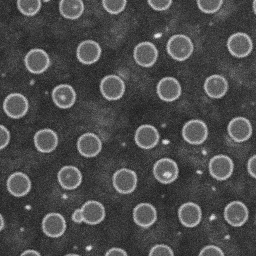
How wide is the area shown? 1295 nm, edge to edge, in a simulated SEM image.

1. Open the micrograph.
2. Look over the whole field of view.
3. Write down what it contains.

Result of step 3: a regular array of raised bodies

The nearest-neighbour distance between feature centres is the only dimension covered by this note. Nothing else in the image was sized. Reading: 0.215 um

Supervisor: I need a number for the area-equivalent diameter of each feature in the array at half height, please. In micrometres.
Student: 0.117